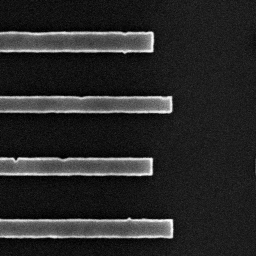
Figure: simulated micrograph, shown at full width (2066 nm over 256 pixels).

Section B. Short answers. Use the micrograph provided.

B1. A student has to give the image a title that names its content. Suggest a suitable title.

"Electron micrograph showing parallel lines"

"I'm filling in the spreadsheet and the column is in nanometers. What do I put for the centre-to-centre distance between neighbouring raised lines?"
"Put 502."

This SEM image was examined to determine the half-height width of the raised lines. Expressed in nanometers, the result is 137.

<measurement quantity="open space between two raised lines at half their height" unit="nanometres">369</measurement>